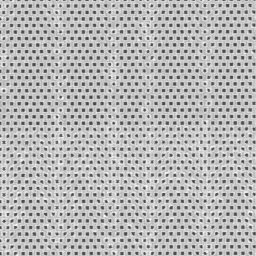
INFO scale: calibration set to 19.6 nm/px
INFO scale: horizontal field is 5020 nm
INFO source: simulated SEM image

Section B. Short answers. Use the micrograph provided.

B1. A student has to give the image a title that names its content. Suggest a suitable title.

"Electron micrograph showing a regular array of holes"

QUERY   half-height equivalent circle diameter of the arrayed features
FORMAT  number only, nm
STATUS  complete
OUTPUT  79.8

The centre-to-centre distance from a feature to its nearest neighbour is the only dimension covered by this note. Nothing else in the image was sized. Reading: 139 nm